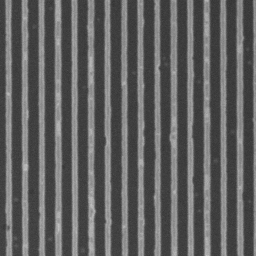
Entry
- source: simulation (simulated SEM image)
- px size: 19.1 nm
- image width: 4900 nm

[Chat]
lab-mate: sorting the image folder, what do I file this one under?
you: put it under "parallel lines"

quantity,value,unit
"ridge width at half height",0.0742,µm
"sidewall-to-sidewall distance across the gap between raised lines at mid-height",234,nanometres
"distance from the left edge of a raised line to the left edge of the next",316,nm